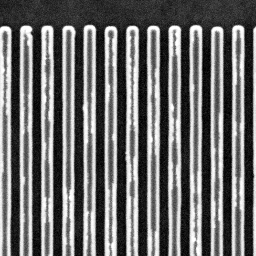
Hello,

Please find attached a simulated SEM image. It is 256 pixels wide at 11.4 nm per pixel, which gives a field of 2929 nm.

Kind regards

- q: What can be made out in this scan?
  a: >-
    parallel lines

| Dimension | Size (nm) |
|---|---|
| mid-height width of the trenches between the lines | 137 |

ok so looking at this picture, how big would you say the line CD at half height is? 106 nm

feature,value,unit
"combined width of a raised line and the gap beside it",243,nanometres